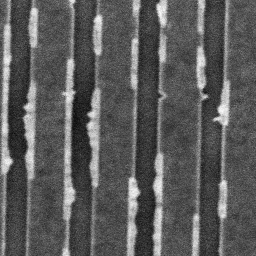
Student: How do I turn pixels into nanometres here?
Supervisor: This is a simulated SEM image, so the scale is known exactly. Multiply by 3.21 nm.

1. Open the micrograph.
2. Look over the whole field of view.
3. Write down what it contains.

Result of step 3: one or a few lines or trenches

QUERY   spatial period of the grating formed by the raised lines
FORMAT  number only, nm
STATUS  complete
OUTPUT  208